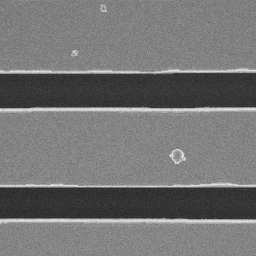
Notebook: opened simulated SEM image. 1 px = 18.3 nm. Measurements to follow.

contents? lines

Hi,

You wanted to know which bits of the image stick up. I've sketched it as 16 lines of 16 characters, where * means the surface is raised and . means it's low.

****************
****************
****************
****************
**************..
................
................
****************
****************
****************
****************
****************
................
................
****************
****************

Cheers